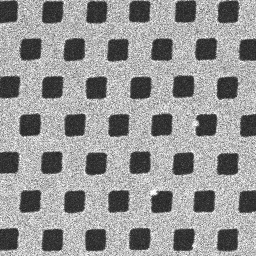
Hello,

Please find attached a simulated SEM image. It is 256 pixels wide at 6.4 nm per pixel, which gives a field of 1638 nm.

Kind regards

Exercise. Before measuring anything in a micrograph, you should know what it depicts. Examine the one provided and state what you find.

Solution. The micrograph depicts a regular array of holes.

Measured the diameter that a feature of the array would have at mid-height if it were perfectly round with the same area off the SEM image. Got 153 nm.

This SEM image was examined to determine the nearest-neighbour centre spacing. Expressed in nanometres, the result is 277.